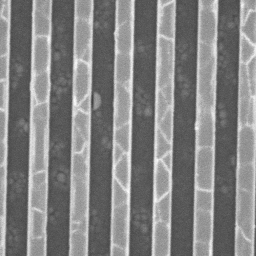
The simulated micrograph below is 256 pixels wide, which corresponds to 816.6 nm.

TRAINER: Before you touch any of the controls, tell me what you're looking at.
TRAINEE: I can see parallel lines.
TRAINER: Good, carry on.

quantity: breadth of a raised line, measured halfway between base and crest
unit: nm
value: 56.2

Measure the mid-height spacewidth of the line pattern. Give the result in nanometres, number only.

74.9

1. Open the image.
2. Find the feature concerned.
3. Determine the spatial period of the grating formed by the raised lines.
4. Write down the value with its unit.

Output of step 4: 132 nanometers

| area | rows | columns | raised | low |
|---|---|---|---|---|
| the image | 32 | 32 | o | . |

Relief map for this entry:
o...oo...ooo...oo...oo...oo...oo
o...oo...ooo...oo...oo...oo...oo
o...oo...oo....oo...oo...oo...oo
o...oo...oo...ooo...oo...oo...oo
o...oo...oo...ooo...oo...oo...oo
o...oo...oo...ooo...oo...oo...oo
o...oo...oo...ooo...oo...oo...oo
o...oo...oo...ooo...oo...oo...oo
o...oo...oo...oo....oo...oo...oo
o...oo...oo...oo....oo...oo...oo
o...oo...oo...oo....oo...oo...oo
o...oo...oo...oo....oo...oo...oo
o...oo...oo...oo....oo...oo...oo
o...oo...oo...oo....oo...oo...oo
o...oo...oo...oo....oo...oo...oo
o...oo...oo...oo...oo....oo...oo
o...oo...oo...oo...ooo...oo...oo
o...oo...oo...oo...ooo...oo...oo
o...oo...oo...oo...ooo...oo...oo
o...oo...oo...oo...oo....oo...oo
o...oo...oo...oo...oo....oo...oo
o...oo...oo...oo...oo...ooo...oo
o...oo...oo...oo...oo...ooo...oo
o...oo...oo...oo...oo...ooo...oo
o...oo...oo...oo...oo...ooo...oo
o...oo...oo...oo...oo...ooo...oo
o...oo...oo...oo...oo...ooo...oo
o...oo...oo...oo...oo...ooo..ooo
o...oo...oo...oo...oo...ooo..ooo
....oo...oo...oo...oo...ooo..ooo
....oo...oo...oo...oo...oo...ooo
...ooo...oo...oo...oo...oo...ooo